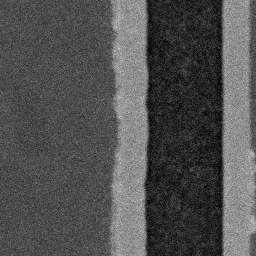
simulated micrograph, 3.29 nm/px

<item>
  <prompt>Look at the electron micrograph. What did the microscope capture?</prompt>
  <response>one or a few lines or trenches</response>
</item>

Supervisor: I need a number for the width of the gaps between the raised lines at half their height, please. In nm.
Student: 334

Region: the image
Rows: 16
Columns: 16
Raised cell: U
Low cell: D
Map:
UUUUUUUUDDDDDDDU
UUUUUUUUDDDDDDDU
UUUUUUUUDDDDDDDU
UUUUUUUUDDDDDDDU
UUUUUUUUDDDDDDDU
UUUUUUUUDDDDDDDU
UUUUUUUUDDDDDDDU
UUUUUUUUDDDDDDDU
UUUUUUUUDDDDDDDU
UUUUUUUUDDDDDDDU
UUUUUUUUDDDDDDDU
UUUUUUUUDDDDDDDU
UUUUUUUUDDDDDDDU
UUUUUUUUDDDDDDDU
UUUUUUUUDDDDDDDU
UUUUUUUUDDDDDDDU